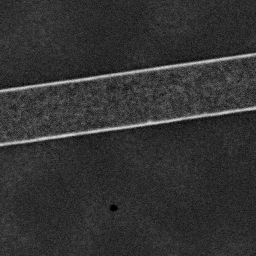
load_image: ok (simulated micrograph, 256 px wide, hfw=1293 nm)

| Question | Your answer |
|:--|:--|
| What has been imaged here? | one or a few lines or trenches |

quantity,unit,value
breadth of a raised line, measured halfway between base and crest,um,0.274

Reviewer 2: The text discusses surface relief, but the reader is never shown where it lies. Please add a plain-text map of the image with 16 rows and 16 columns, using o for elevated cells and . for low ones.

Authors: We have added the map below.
................
................
................
...............o
........oooooooo
.ooooooooooooooo
oooooooooooooooo
ooooooooooo.....
oooo............
................
................
................
................
................
................
................